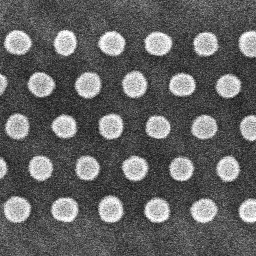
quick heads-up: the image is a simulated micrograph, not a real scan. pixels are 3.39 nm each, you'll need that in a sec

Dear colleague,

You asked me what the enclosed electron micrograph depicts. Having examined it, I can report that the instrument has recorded a regular array of raised bodies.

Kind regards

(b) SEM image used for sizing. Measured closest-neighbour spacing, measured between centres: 158 nanometres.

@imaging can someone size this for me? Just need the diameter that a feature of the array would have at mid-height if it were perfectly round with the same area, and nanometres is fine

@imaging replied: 76.5